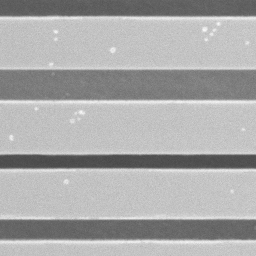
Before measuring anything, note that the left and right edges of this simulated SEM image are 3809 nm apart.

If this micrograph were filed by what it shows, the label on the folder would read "lines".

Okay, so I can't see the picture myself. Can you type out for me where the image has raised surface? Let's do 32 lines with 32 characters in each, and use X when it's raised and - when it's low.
--------------------------------
--------------------------------
XXXXXXXXXXXXXXXXXXXXXXXXXXXXXXXX
XXXXXXXXXXXXXXXXXXXXXXXXXXXXXXXX
XXXXXXXXXXXXXXXXXXXXXXXXXXXXXXXX
XXXXXXXXXXXXXXXXXXXXXXXXXXXXXXXX
XXXXXXXXXXXXXXXXXXXXXXXXXXXXXXXX
XXXXXXXXXXXXXXXXXXXXXXXXXXXXXXXX
XXXXXXXXXXXXXXXXXXXXXXXXXXXXXXXX
--------------------------------
--------------------------------
--------------------------------
--------------------------------
XXXXXXXXXXXXXXXXXXXXXXXXXXXXXXXX
XXXXXXXXXXXXXXXXXXXXXXXXXXXXXXXX
XXXXXXXXXXXXXXXXXXXXXXXXXXXXXXXX
XXXXXXXXXXXXXXXXXXXXXXXXXXXXXXXX
XXXXXXXXXXXXXXXXXXXXXXXXXXXXXXXX
XXXXXXXXXXXXXXXXXXXXXXXXXXXXXXXX
--------------------------------
--------------------------------
XXXXXXXXXXXXXXXXXXXXXXXXXXXXXXXX
XXXXXXXXXXXXXXXXXXXXXXXXXXXXXXXX
XXXXXXXXXXXXXXXXXXXXXXXXXXXXXXXX
XXXXXXXXXXXXXXXXXXXXXXXXXXXXXXXX
XXXXXXXXXXXXXXXXXXXXXXXXXXXXXXXX
XXXXXXXXXXXXXXXXXXXXXXXXXXXXXXXX
--------------------------------
--------------------------------
--------------------------------
XXXXXXXXXXXXXXXXXXXXXXXXXXXXXXXX
XXXXXXXXXXXXXXXXXXXXXXXXXXXXXXXX